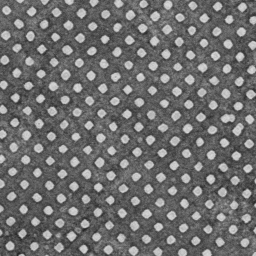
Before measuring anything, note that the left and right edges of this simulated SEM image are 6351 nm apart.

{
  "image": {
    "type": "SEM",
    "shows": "a regular array of raised bodies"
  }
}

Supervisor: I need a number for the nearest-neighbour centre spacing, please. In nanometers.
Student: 427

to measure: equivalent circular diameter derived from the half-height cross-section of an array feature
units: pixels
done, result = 7.27